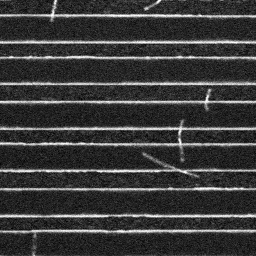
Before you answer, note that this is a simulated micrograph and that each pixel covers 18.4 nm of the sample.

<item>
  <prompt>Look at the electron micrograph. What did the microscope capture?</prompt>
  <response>lines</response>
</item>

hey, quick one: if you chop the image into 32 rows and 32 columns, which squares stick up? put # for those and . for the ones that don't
................................
................................
################################
################################
################################
................................
................................
################################
################################
################################
################################
................................
................................
################################
################################
################################
................................
................................
################################
################################
################################
................................
................................
................................
################################
################################
################################
................................
................................
################################
################################
################################